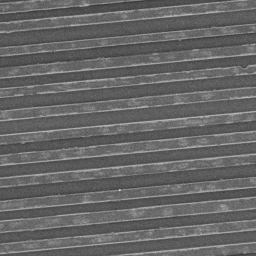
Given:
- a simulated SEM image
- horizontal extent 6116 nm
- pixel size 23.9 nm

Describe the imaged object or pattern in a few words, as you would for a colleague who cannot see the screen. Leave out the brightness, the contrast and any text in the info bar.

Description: parallel lines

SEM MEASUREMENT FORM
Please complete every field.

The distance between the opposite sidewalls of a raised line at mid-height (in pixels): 9.71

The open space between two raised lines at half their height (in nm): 297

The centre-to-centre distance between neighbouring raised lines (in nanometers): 524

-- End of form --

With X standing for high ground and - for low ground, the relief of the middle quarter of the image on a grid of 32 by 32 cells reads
XXXXXXXXXXXXXX------------------
XXXX----------------------------
--------------------------XXXXXX
---------------XXXXXXXXXXXXXXXXX
-----XXXXXXXXXXXXXXXXXXX--------
XXXXXXXXXXXXX-------------------
XX------------------------------
-----------------------------XXX
-------------------XXXXXXXXXXXXX
--------XXXXXXXXXXXXXXXXXXXXXXXX
XXXXXXXXXXXXXXXXXXXXX-----------
XXXXXXXXXXX---------------------
X-------------------------------
--------------------------------
-------------------XXXXXXXXXXXXX
-----------XXXXXXXXXXXXXXXXXXXXX
-XXXXXXXXXXXXXXXXXXXXX----------
XXXXXXXXXXX---------------------
X------------------------------X
--------------------XXXXXXXXXXXX
----------XXXXXXXXXXXXXXXXXXXXXX
XXXXXXXXXXXXXXXXXXXXXXXXXX------
XXXXXXXXXXXXXX------------------
XXXX----------------------------
-----------------------------XXX
------------------XXXXXXXXXXXXXX
--------XXXXXXXXXXXXXXXXXXXXX---
XXXXXXXXXXXXXXXXXXX-------------
XXXXXXXX------------------------
--------------------------------
-------------------------XXXXXXX
--------------XXXXXXXXXXXXXXXXXX